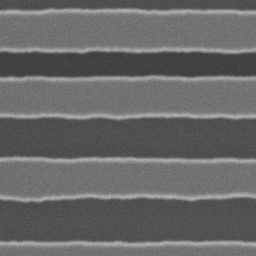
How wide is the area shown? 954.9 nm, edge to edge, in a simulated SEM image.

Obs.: lines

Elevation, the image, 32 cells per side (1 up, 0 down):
00000000000000000000000000000000
11111111111111111111111111111111
11111111111111111111111111111111
11111111111111111111111111111111
11111111111111111111111111111111
11111111111111111111111111111111
01110111111000011111001101111111
00000000000000000000000000000000
00000000000000000000000000000000
00000000000000000011100000000000
11111111111111111111111111111111
11111111111111111111111111111111
11111111111111111111111111111111
11111111111111111111111111111111
11111111111111111111111111111111
00000000000000000000000000000000
00000000000000000000000000000000
00000000000000000000000000000000
00000000000000000000000000000000
00000000000000000000000000000000
11111111111111111111111111111111
11111111111111111111111111111111
11111111111111111111111111111111
11111111111111111111111111111111
11111111111111111111111111111111
00000000000000000000000000000000
00000000000000000000000000000000
00000000000000000000000000000000
00000000000000000000000000000000
00000000000000000000000000000000
11111111111111111111111111111111
11111111111111111111111111111111